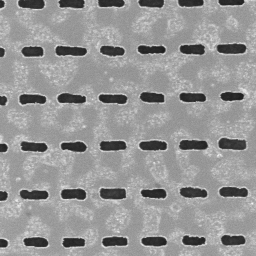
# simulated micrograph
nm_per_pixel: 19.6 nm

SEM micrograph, a regular array of holes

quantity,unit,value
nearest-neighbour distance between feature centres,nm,767